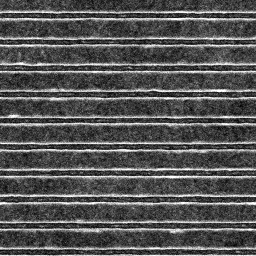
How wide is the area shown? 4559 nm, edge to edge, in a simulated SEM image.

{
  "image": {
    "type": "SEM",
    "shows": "parallel lines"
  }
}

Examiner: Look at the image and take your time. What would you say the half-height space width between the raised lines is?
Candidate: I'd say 107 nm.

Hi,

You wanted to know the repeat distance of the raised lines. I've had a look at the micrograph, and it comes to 468 nm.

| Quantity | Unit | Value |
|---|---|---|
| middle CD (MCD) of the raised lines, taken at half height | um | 0.363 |